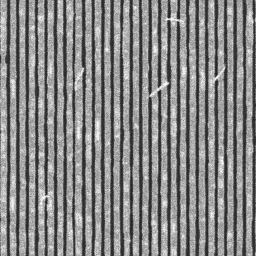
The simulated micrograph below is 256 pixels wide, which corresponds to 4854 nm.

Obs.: parallel lines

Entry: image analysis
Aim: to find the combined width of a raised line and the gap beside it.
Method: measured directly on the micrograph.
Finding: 0.179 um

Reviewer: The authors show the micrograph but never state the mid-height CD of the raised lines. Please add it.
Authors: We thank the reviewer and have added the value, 111 nm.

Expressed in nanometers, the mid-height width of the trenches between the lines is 64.